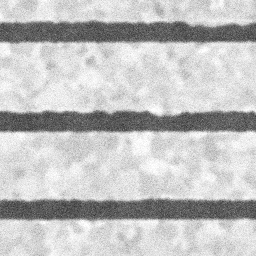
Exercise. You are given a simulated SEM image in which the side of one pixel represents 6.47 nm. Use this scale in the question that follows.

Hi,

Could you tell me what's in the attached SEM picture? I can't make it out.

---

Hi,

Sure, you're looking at lines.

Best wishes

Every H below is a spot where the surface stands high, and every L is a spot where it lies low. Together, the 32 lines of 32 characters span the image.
HHHHHHHHHHHHHHHHHHHHHHHHHHHHHHHH
HHHHHHHHHHHHHHHHHHHHHHHHHHHHHHHH
HHHHHHHHHHHHHHHHHHHHHHHHHHHHHHHH
LLLLLLLLLLLLLLLLLLLLLLLLLLLLLLLL
LLLLLLLLLLLLLLLLLLLLLLLLLLLLLLLL
HHHHHHHHHHHHHHHHHHHHHHHHHHHHHHHH
HHHHHHHHHHHHHHHHHHHHHHHHHHHHHHHH
HHHHHHHHHHHHHHHHHHHHHHHHHHHHHHHH
HHHHHHHHHHHHHHHHHHHHHHHHHHHHHHHH
HHHHHHHHHHHHHHHHHHHHHHHHHHHHHHHH
HHHHHHHHHHHHHHHHHHHHHHHHHHHHHHHH
HHHHHHHHHHHHHHHHHHHHHHHHHHHHHHHH
HHHHHHHHHHHHHHHHHHHHHHHHHHHHHHHH
HHHHHHHHHHHHHHHHHHHHHHHHHHHHHHHH
LLLLLLLLLLLLLLLLLLLLLLLLLLLLLLLL
LLLLLLLLLLLLLLLLLLLLLLLLLLLLLLLL
LLLLLLLLLLLLLLLLLLLLLLLLLLLLLLLL
HHHHHHHHHHHHHHHHHHHHHHHHHHHHHHHH
HHHHHHHHHHHHHHHHHHHHHHHHHHHHHHHH
HHHHHHHHHHHHHHHHHHHHHHHHHHHHHHHH
HHHHHHHHHHHHHHHHHHHHHHHHHHHHHHHH
HHHHHHHHHHHHHHHHHHHHHHHHHHHHHHHH
HHHHHHHHHHHHHHHHHHHHHHHHHHHHHHHH
HHHHHHHHHHHHHHHHHHHHHHHHHHHHHHHH
HHHHHHHHHHHHHHHHHHHHHHHHHHHHHHHH
LLLLLLLLLLLLLLLLLLLLLLLLLLLLLLLL
LLLLLLLLLLLLLLLLLLLLLLLLLLLLLLLL
LLLLLLLLLLLLLLLLLLLLLLLLLLLLLLHH
HHHHHHHHHHHHHHHHHHHHHHHHHHHHHHHH
HHHHHHHHHHHHHHHHHHHHHHHHHHHHHHHH
HHHHHHHHHHHHHHHHHHHHHHHHHHHHHHHH
HHHHHHHHHHHHHHHHHHHHHHHHHHHHHHHH